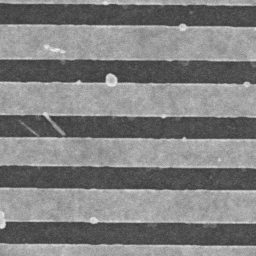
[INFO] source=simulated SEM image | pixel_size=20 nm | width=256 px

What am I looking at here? lines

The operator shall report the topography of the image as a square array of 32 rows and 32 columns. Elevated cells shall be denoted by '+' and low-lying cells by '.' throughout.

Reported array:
...........+++++++++++++++++++++
................................
................................
++++++++++++++++++++++++++++++++
++++++++++++++++++++++++++++++++
++++++++++++++++++++++++++++++++
++++++++++++++++++++++++++++++++
.....................+....++++++
................................
.............+..................
+++++++++++++++++.+...........+.
++++++++++++++++++++++++++++++++
++++++++++++++++++++++++++++++++
++++++++++++++++++++++++++++++++
.....++.......+.++++++++++++++++
................................
................................
++++++++++++++++++++++++++++++++
++++++++++++++++++++++++++++++++
++++++++++++++++++++++++++++++++
++++++++++++++++++++++++++++++++
................................
................................
................................
++++++++++++++++++++++++++++++++
++++++++++++++++++++++++++++++++
++++++++++++++++++++++++++++++++
++++++++++++++++++++++++++++++++
................................
................................
+..+............................
++++++++++++++++++++++++++++++++